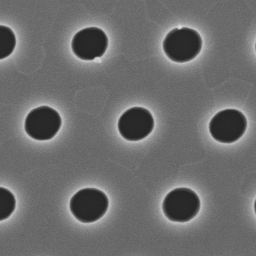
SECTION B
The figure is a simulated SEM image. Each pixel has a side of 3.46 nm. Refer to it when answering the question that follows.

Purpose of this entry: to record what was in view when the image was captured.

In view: holes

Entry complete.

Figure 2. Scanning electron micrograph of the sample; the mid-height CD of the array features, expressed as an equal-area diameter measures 0.118 um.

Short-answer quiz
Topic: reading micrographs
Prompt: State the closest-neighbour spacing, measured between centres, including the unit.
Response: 317 nm